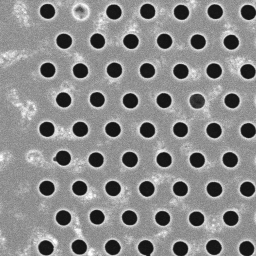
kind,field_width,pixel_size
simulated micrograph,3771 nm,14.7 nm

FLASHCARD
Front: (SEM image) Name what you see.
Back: a regular array of holes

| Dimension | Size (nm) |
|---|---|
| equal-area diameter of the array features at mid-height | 227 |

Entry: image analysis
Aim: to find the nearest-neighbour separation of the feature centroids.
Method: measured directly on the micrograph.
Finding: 0.488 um